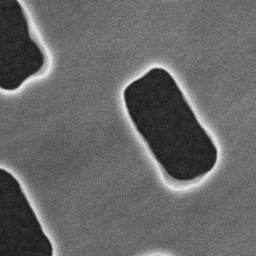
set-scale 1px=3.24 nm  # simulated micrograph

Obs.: holes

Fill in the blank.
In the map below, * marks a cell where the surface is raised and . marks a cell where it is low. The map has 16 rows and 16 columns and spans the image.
.***************
..**************
..**************
...*************
...******.******
.*******...*****
********....****
********....****
*********....***
*********....***
**********...***
.***************
..**************
..**************
...*************
...*************